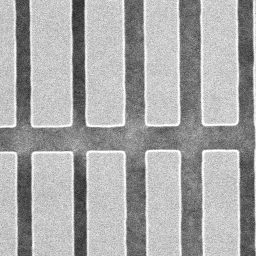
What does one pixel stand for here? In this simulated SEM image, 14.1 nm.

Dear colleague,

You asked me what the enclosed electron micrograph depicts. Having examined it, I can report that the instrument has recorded groups of lines, slits or small figures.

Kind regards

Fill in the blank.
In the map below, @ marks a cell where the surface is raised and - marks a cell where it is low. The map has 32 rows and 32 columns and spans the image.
@@--@@@@@--@@@@---@@@@---@@@@@--
@@--@@@@@--@@@@---@@@@---@@@@@--
@@--@@@@@--@@@@---@@@@---@@@@@--
@@--@@@@@--@@@@---@@@@---@@@@@--
@@--@@@@@--@@@@---@@@@---@@@@@--
@@--@@@@@--@@@@---@@@@---@@@@@--
@@--@@@@@--@@@@---@@@@---@@@@@--
@@--@@@@@--@@@@---@@@@---@@@@@--
@@--@@@@@--@@@@---@@@@---@@@@@--
@@--@@@@@--@@@@---@@@@---@@@@@--
@@--@@@@@--@@@@---@@@@---@@@@@--
@@--@@@@@--@@@@@--@@@@---@@@@@--
@@--@@@@@--@@@@@--@@@@---@@@@@--
@@--@@@@@--@@@@@--@@@@---@@@@@--
@@--@@@@@--@@@@---@@@@---@@@@@--
@@--@@@@@--@@@@---@@@@----@@@---
--------------------------------
--------------------------------
--------------------------------
@@--@@@@@--@@@@@--@@@@@--@@@@@--
@@--@@@@@--@@@@@--@@@@@--@@@@@--
@@--@@@@@--@@@@@--@@@@---@@@@@--
@@--@@@@@--@@@@@--@@@@---@@@@@--
@@--@@@@@--@@@@@--@@@@@--@@@@@--
@@--@@@@@--@@@@@--@@@@@--@@@@@--
@@--@@@@@--@@@@@--@@@@@--@@@@@--
@@--@@@@@--@@@@@--@@@@@--@@@@@--
@@--@@@@@--@@@@@--@@@@@--@@@@@--
@@--@@@@@--@@@@@--@@@@---@@@@@--
@@--@@@@@--@@@@@--@@@@---@@@@@--
@@--@@@@@--@@@@@--@@@@@--@@@@@--
@@--@@@@@--@@@@@--@@@@@--@@@@@--